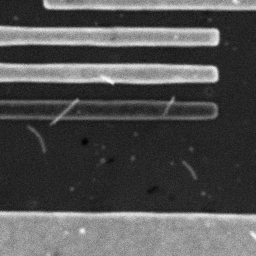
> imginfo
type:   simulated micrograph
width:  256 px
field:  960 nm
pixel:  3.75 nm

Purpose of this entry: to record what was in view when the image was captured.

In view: wiring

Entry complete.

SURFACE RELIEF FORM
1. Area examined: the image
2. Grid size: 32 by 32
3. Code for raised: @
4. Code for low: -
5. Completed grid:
------@@@@@@@@@@@@@@@@@@@@@@@@@@
--------------------------------
--------------------------------
@@@-----------------------------
@@@@@@@@@@@@@@@@@@@@@@@@@@@-----
@-----------@@@@@@@@@@@@@@@-----
--------------------------------
--------------------------------
@@@@@@@@@@@@@@@@@@@@@@@@@@@-----
@@@@@@@@@@@@@@@@@@@@@@@@@@@-----
--------------------------------
--------------------------------
--------------------------------
@@@@@@@@@@@@@@@@@@@@@@@@@@@-----
@@@@@@@@@@@@@@@@@@@@@@@@@@@-----
--------------------------------
--------------------------------
--------------------------------
--------------------------------
--------------------------------
--------------------------------
--------------------------------
--------------------------------
--------------------------------
--------------------------------
--------------------------------
--------------------------------
@@@@@@@@@@@@@@@@@@@@@@@@@@@@@@@@
@@@@@@@@@@@@@@@@@@@@@@@@@@@@@@@@
@@@@@@@@@@@@@@@@@@@@@@@@@@@@@@@@
@@@@@@@@@@@@@@@@@@@@@@@@@@@@@@@@
@@@@@@@@@@@@@@@@@@@@@@@@@@@@@@@@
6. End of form